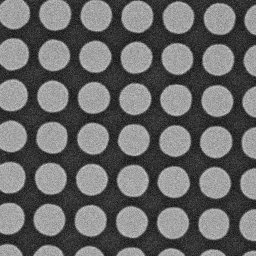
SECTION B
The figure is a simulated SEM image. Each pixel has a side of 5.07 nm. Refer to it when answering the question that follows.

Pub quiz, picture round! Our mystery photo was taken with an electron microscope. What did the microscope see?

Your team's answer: an array of small figures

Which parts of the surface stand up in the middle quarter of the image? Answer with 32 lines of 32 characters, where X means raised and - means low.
-----XXXXXX----XXXXXX----XXXXXXX
------XXXX------XXXX------XXXXX-
--------------------------------
--------------------------------
--------------------------------
-----XXXXX------XXXX-------XXX--
X---XXXXXXX----XXXXXX----XXXXXX-
X---XXXXXXX---XXXXXXX----XXXXXXX
X---XXXXXXX---XXXXXXXX--XXXXXXXX
X---XXXXXXX---XXXXXXXX--XXXXXXXX
----XXXXXXX---XXXXXXX----XXXXXX-
-----XXXXX-----XXXXX-----XXXXXX-
------------------X-------XXXX--
--------------------------------
--------------------------------
-----XXXX-------XXX-------------
----XXXXXX-----XXXXX-----XXXXX--
X---XXXXXXX---XXXXXXX---XXXXXXX-
X--XXXXXXXX---XXXXXXX---XXXXXXXX
X---XXXXXXX---XXXXXXX---XXXXXXXX
----XXXXXXX---XXXXXXX---XXXXXXX-
-----XXXXX-----XXXXX-----XXXXXX-
----------------XXX-------XXXX--
--------------------------------
--------------------------------
-----XXXX-------XXX-------------
----XXXXXX-----XXXXX-----XXXXX--
---XXXXXXX----XXXXXXX---XXXXXXX-
---XXXXXXXX---XXXXXXX---XXXXXXX-
---XXXXXXXX---XXXXXXX---XXXXXXX-
---XXXXXXX----XXXXXXX---XXXXXXX-
----XXXXXX----XXXXXX----XXXXXXX-